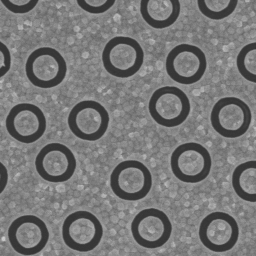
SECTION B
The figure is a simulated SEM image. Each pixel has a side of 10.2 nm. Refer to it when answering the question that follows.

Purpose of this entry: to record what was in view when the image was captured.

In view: a regular array of ring-shaped grooves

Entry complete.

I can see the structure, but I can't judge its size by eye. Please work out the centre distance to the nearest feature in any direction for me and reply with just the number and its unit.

553 nm